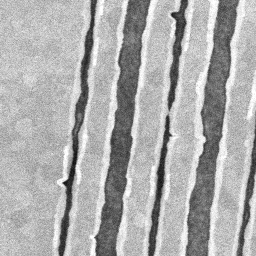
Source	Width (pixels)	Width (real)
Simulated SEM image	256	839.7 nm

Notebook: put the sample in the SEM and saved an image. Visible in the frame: parallel lines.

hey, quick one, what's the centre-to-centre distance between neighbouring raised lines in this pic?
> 151 nanometers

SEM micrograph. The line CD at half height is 86.7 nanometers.